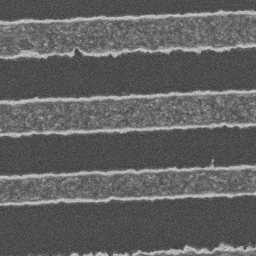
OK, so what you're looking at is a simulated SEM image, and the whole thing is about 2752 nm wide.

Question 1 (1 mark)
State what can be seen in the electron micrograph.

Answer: one or a few lines or trenches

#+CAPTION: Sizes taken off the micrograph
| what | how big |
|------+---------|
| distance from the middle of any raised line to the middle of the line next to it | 0.809 microns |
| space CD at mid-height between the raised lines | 472 nm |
